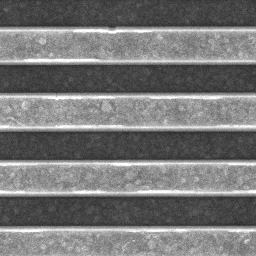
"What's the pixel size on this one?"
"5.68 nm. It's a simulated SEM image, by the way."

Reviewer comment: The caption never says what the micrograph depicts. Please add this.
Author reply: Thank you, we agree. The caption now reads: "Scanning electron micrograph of one or a few lines or trenches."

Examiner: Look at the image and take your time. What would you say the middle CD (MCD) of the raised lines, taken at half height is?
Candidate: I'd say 0.198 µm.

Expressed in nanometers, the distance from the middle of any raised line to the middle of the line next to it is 375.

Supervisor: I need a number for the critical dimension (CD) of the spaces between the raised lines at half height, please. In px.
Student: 32.4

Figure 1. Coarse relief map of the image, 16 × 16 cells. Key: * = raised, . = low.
................
................
****************
****************
................
................
****************
****************
................
................
****************
****************
................
................
****************
****************